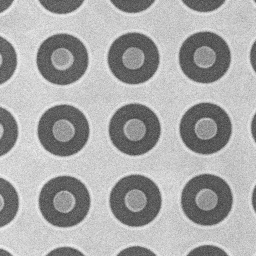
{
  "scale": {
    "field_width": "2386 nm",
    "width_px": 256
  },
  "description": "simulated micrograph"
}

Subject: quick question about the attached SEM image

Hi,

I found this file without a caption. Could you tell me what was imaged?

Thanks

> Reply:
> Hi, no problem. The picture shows an array of small figures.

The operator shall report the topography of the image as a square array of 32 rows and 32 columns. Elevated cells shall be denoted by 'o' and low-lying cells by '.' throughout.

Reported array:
..ooo.....oooo.....oooo.....oooo
.ooooo...oooooo...oooooo...ooooo
oooooooooooooooooooooooooooooooo
oooooooooooooooooooooooooooooooo
oooooo....ooooo....ooooo....oooo
..ooo......ooo......ooo......oo.
..ooo......oo.......oo.......oo.
..oo.......oo.......oo.......oo.
..ooo......ooo......oo.......oo.
..ooo.....oooo.....oooo.....oooo
.ooooo...ooooooo..ooooooo..ooooo
oooooooooooooooooooooooooooooooo
oooooooooooooooooooooooooooooooo
.ooooo....ooooo....ooooo....oooo
..ooo......ooo......ooo......ooo
..ooo......ooo......oo.......oo.
..oo.......oo.......oo.......oo.
..ooo......ooo......ooo......ooo
..ooo......ooo.....oooo.....oooo
.oooooo..ooooooo..oooooooooooooo
oooooooooooooooooooooooooooooooo
oooooooooooooooooooooooooooooooo
.ooooo....ooooo....ooooo....oooo
..ooo......ooo......ooo......ooo
..ooo......ooo......ooo......oo.
..ooo......ooo......ooo......oo.
..ooo......ooo......ooo......ooo
..oooo.....oooo....ooooo....oooo
oooooooo.ooooooooooooooooooooooo
oooooooooooooooooooooooooooooooo
ooooooooooooooooooooooooo..ooooo
.ooooo....ooooo....ooooo....oooo